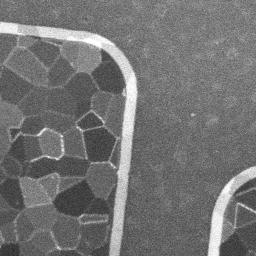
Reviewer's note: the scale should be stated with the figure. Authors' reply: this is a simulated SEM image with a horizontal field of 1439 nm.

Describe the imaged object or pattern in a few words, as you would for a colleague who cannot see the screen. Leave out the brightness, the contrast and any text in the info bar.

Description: one or a few lines or trenches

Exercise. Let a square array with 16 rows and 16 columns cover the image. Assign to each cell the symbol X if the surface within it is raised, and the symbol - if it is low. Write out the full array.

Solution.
----------------
----------------
XXXXXX----------
XXXXXXX---------
XXXXXXXX--------
XXXXXXXX--------
XXXXXXXX--------
XXXXXXXX--------
XXXXXXXX--------
XXXXXXXX--------
XXXXXXXX--------
XXXXXXXX-------X
XXXXXXXX------XX
XXXXXXX-------XX
XXXXXXX-------XX
XXXXXXX------XXX